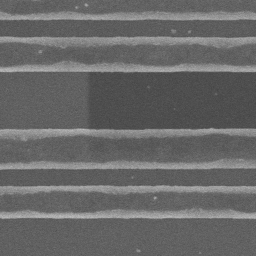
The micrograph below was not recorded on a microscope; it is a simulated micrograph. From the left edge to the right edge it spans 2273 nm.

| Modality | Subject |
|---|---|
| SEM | lines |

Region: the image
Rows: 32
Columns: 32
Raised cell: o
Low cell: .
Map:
oooooooooooooooooooooooooooooooo
oooooooooooooooooooooooooooooooo
................................
................................
................................
oooooooooooooooooooooooooooooooo
oooooooooooooooooooooooooooooooo
oooooooooooooooooooooooooooooooo
oooooooo.ooooooooooooooooooooooo
................................
................................
................................
................................
................................
................................
................................
.........oo.............ooooooo.
oooooooooooooooooooooooooooooooo
oooooooooooooooooooooooooooooooo
oooooooooooooooooooooooooooooooo
oooooooooooooooooooooooooooooooo
................................
................................
......ooooooo......oo...........
oooooooooooooooooooooooooooooooo
oooooooooooooooooooooooooooooooo
oooooooooooooooooooooooooooooooo
................................
................................
................................
................................
................................